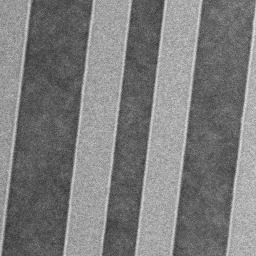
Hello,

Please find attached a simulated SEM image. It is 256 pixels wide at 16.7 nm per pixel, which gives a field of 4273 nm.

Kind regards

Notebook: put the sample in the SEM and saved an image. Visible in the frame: one or a few lines or trenches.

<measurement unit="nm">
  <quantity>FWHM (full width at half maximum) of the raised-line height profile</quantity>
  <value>577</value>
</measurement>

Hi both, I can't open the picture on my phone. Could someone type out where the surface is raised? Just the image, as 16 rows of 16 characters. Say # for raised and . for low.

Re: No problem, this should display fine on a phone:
##....##..##....
##....##..##....
##....##..##....
#....###..##....
#....###..##....
#....###..##...#
#....##...##...#
#....##...##...#
#....##..###...#
#....##..##....#
#....##..##....#
#....##..##....#
....###..##....#
....###..##...##
....##...##...##
....##...##...##